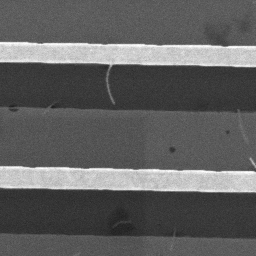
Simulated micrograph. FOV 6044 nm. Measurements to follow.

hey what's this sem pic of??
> lines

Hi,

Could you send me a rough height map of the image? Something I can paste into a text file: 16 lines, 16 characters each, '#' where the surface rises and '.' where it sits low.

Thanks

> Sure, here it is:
################
################
################
################
................
................
................
################
################
################
################
################
................
................
................
################